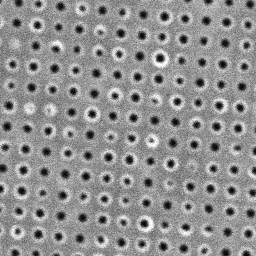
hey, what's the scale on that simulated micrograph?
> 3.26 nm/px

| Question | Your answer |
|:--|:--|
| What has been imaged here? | a regular array of holes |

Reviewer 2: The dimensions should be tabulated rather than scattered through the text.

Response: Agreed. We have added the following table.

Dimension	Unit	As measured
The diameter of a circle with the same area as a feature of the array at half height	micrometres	0.0278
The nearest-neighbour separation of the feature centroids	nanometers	66.7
